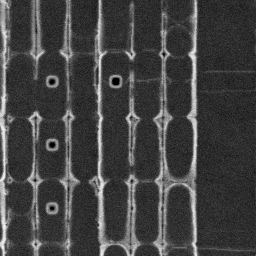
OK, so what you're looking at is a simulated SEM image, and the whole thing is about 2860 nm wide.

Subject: wiring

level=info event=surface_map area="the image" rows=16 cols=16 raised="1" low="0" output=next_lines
0000001111110000
0000001111110000
0000001111110000
0000001111110000
0000001111110000
0000001111110000
0000001111110000
0000001111110000
0000001111110000
0000001111110000
0000001111110000
0000001111110000
0000001111110000
0000001111110000
0000001111110000
0000001111110000